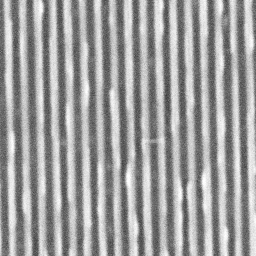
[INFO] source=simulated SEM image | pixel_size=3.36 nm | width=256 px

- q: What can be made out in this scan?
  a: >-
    parallel lines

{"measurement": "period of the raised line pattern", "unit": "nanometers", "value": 50.6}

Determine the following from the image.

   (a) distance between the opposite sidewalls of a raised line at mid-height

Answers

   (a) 0.0206 µm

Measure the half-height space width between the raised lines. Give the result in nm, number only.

29.4